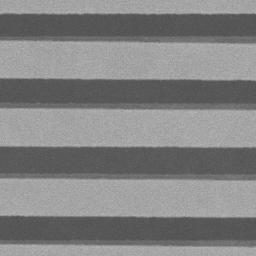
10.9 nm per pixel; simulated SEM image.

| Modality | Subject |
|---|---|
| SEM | lines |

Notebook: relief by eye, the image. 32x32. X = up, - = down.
XXXXXXXXXXXXXXXXXXXXXXXXXXXXXXXX
XXXXXXXXXXXXXXXXXXXXXXXXXXXXXXXX
--------------------------------
--------------------------------
--------------------------------
XXXXXXXXXXXXXXXXXXXXXXXXXXXXX---
XXXXXXXXXXXXXXXXXXXXXXXXXXXXXXXX
XXXXXXXXXXXXXXXXXXXXXXXXXXXXXXXX
XXXXXXXXXXXXXXXXXXXXXXXXXXXXXXXX
XXXXXXXXXXXXXXXXXXXXXXXXXXXXXXXX
--------------------------------
--------------------------------
--------------------------------
--------------------------------
XXXXXXXXXXXXXXXXXXXXXXXXXXXXXXXX
XXXXXXXXXXXXXXXXXXXXXXXXXXXXXXXX
XXXXXXXXXXXXXXXXXXXXXXXXXXXXXXXX
XXXXXXXXXXXXXXXXXXXXXXXXXXXXXXXX
--------------------------------
--------------------------------
--------------------------------
--------------------------------
XXXXXXXXXXXXXXX-----------------
XXXXXXXXXXXXXXXXXXXXXXXXXXXXXXXX
XXXXXXXXXXXXXXXXXXXXXXXXXXXXXXXX
XXXXXXXXXXXXXXXXXXXXXXXXXXXXXXXX
XXXXXXXXXXXXXXXXXXXXXXXXXXXXXXXX
--------------------------------
--------------------------------
--------------------------------
--------------------------------
XXXXXXXXXXXXXXXXXXXXXXXXXXXXXXXX